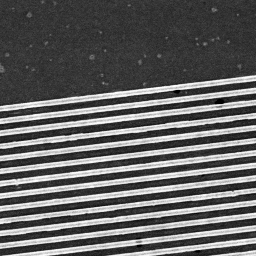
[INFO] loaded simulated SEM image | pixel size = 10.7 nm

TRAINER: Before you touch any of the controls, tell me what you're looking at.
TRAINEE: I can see parallel lines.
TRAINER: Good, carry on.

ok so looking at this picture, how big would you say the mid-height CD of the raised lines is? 41.2 nm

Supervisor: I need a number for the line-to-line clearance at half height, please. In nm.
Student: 93.1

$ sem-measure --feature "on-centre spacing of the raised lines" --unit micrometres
0.133